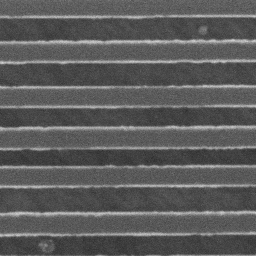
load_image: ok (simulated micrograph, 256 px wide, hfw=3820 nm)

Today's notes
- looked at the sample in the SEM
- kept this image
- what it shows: lines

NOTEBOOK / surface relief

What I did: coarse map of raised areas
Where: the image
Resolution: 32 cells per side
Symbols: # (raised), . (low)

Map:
################################
################################
................................
................................
................................
################################
################################
################################
................................
................................
................................
################################
################################
................................
................................
................................
################################
################################
######################.##.#.#...
................................
................................
################################
################################
................................
................................
................................
.........................#.#.###
################################
################################
................................
................................
................................